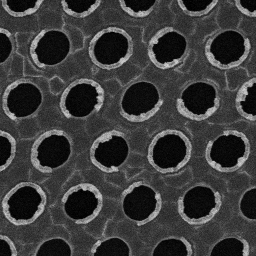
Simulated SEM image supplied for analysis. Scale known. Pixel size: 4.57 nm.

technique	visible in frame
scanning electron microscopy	a regular array of holes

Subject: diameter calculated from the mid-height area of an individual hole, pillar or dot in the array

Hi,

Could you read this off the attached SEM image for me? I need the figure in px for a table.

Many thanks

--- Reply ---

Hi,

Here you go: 33.3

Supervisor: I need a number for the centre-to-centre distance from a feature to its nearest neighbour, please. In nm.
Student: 265